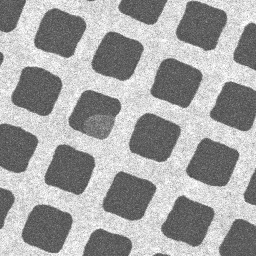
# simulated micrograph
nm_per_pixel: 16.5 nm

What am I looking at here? a regular array of holes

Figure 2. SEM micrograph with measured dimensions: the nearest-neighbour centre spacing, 1.03 µm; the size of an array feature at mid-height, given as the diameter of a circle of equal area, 0.795 um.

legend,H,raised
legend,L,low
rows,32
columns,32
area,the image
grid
LLLHHHHHHHHHHHHLLLLLLHHLLLHHHHHH
LLLHHHLLHHHHHHHLLLLLHHHLLLLLHHHH
LLHHHLLLLLLHHHHHHLLLHHHLLLLLHHHH
LLHHHLLLLLLHHHHHHHHHHHLLLLLLHHHL
HHHHLLLLLLHHHLLLHHHHHHLLLLLHHHLL
HHHHLLLLLLHHLLLLLLHHHHHHLLLHHHLL
HHHHHHLLLHHHLLLLLLHHHHHHHHHHHLLL
HHHHHHHHHHHHLLLLLHHHHLHHHHHHHLLL
HHHLLHHHHHHHLLLLLHHHLLLLLHHHHHHL
HHHLLLLHHHHHHLLLHHHLLLLLLHHHHHHH
HHLLLLLLHHHHHHHHHHHLLLLLLHHHLLHH
HHLLLLLLHHHLHHHHHHHLLLLLLHHHLLLL
HLLLLLLHHHLLLLLHHHHHLLLLHHHLLLLL
HHHLLLLHHLLLLLLHHHHHHHHHHHHLLLLL
HHHHHLHHHLLLLLLHHHLLHHHHHHLLLLLL
LHHHHHHHHLLLLLHHHLLLLLHHHHHHLLLL
LLLLHHHHHHLLLLHHHLLLLLLHHHHHHHHH
LLLLLHHHHHHHHHHHLLLLLLHHHLHHHHHH
LLLLLHHLLHHHHHHHLLLLLLHHHLLLLHHH
LLLLHHHLLLLHHHHHHHLLLHHHLLLLLLHH
LLLLHHLLLLLLHHHHHHHHHHHHLLLLLLHH
HLLHHHLLLLLLHHHLHHHHHHHLLLLLLHHH
HHHHHHLLLLLHHHLLLLHHHHHHLLLLLHHL
HHHHHHHLLLLHHHLLLLLHHHHHHHHHHHHL
LLHHHHHHHHHHHLLLLLLHHHHHHHHHHHLL
LLHHHHHHHHHHHLLLLLLHHHLLLHHHHHHL
LHHHLLLLHHHHHLLLLLHHHLLLLLLHHHHH
LHHLLLLLLHHHHHHHLHHHHLLLLLLHHHHH
HHHLLLLLLHHHHHHHHHHHLLLLLLHHHLLL
HHHLLLLLHHHLLLLLHHHHHLLLLLHHLLLL
HHHLLLLLHHHLLLLLLHHHHHHLLHHHLLLL
HHHHHHLHHHLLLLLLHHHHHHHHHHHLLLLL